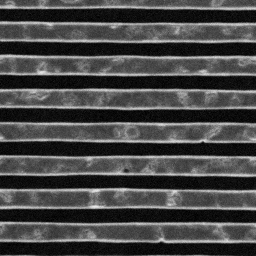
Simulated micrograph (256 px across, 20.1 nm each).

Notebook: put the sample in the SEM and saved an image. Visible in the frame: parallel lines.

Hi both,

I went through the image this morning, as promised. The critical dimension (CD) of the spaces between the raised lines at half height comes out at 286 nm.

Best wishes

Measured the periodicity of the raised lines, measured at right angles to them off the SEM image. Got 668 nm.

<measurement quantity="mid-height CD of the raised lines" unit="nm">374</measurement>